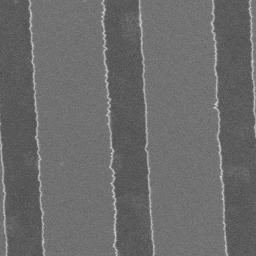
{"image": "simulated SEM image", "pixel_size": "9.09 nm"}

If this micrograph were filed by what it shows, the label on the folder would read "one or a few lines or trenches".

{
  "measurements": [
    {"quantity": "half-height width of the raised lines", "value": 37.2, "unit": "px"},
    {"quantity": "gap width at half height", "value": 657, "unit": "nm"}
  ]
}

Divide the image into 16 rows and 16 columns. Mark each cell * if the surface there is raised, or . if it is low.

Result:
**....***....***
**....***....***
**.....**....***
**.....**....***
**.....**....***
**.....**.....**
**.....**.....**
**.....**.....**
**.....**.....**
**.....**.....**
**.....**.....**
***....**.....**
***....**.....**
***....**.....**
***....***....**
***....***....**